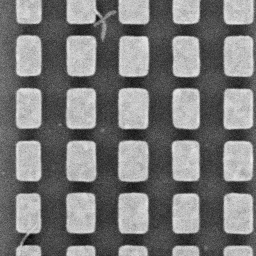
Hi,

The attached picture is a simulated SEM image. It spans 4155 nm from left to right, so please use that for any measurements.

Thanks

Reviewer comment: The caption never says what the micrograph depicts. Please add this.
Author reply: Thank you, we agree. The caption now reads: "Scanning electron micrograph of wiring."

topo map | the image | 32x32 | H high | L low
LLHHHLLLHHHHLLLHHHHLLLHHHLLLHHHH
LLHHHLLLHHHHLLLHHHHLLLHHHLLLHHHH
LLHHHLLLHHHHLLLHHHHLLLHHHLLLHHHL
LLLLLLLLLLLLLLLLLLLLLLLLLLLLLLLL
LLLHLLLLLLLLLLLLLLLLLLLLLLLLLLLL
LLHHHLLLHHHHLLLHHHHLLLHHHLLLHHHL
LLHHHLLLHHHHLLLHHHHLLLHHHLLLHHHL
LLHHHLLLHHHHLLLHHHHLLLHHHLLLHHHH
LLHHHLLLHHHHLLLHHHHLLLHHHLLLHHHH
LLLLLLLLLLLLLLLLLLLLLLHHLLLLLLLL
LLLLLLLLLLLLLLLLLLLLLLLLLLLLLLLL
LLHHHLLLHHHHLLLHHHLLLLHHHLLLHHHL
LLHHHLLLHHHHLLLHHHHLLLHHHLLLHHHL
LLHHHLLLHHHHLLLHHHHLLLHHHLLLHHHL
LLHHHLLLHHHHLLLHHHLLLLHHHLLLHHHL
LLHHHLLLHHHHLLLHHHLLLLHHHLLLHHHL
LLLLLLLLLLLLLLLLLLLLLLLLLLLLLLLL
LLLLLLLLLLLLLLLLLLLLLLLLLLLLLLLL
LLHHHLLLHHHHLLLHHHLLLLHHHLLLHHHL
LLHHHLLLHHHHLLLHHHHLLLHHHLLLHHHL
LLHHHLLLHHHHLLLHHHHLLLHHHLLLHHHL
LLHHHLLLHHHHLLLHHHLLLLHHHLLLHHHL
LLLHHLLLLHHHLLLHHHLLLLHHLLLLHHHL
LLLLLLLLLLLLLLLLLLLLLLLLLLLLLLLL
LLHHHLLLLHHHLLLHHHLLLLHHHLLLHHHL
LLHHHLLLHHHHLLLHHHLLLLHHHLLLHHHL
LLHHHLLLHHHHLLLHHHHLLLHHHLLLHHHL
LLHHHLLLHHHHLLLHHHHLLLHHHLLLHHHL
LLHHHLLLHHHHLLLHHHLLLLHHHLLLHHHL
LLLLLLLLLLLLLLLLLLLLLLLLLLLLLLLL
LLLLLLLLLLLLLLLLLLLLLLLLLLLLLLLL
LLHHHLLLHHHHLLLHHHLLLLHHHLLLHHHL